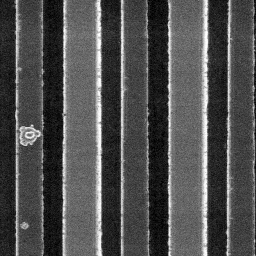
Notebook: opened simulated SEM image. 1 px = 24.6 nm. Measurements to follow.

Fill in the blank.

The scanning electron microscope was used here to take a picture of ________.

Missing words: lines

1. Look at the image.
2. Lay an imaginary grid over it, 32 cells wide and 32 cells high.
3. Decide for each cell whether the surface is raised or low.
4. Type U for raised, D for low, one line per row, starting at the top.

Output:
DDUUUDDDUUUUDDDUUUDDDUUUUUDDDUUU
DDUUUDDDUUUUDDDUUUDDDUUUUUDDDUUU
DDUUUDDDUUUUDDDUUUDDDUUUUUDDDUUU
DDUUUDDDUUUUDDDUUUDDDUUUUUDDDUUU
DDUUUDDDUUUUDDDUUUDDDUUUUUDDDUUU
DDUUUDDDUUUUDDDUUUDDDUUUUUDDDUUU
DDUUUDDDUUUUDDDUUUDDDUUUUUDDDUUU
DDUUUDDDUUUUDDDUUUDDDUUUUUDDDUUU
DDUUUDDDUUUUDDDUUUDDDUUUUUDDDUUU
DDUUUDDDUUUUDDDUUUDDDUUUUUDDDUUU
DDUUUDDDUUUUDDDUUUDDDUUUUUDDDUUU
DDUUUDDDUUUUDDDUUUDDDUUUUUDDDUUU
DDUUUDDDUUUUDDDUUUDDDUUUUUDDDUUU
DDUUUDDDUUUUDDDUUUDDDUUUUUDDDUUU
DDUUUDDDUUUUDDDUUUDDDUUUUUDDDUUU
DDUUUDDDUUUUDDDUUUDDDUUUUUDDDUUU
DDUUUDDDUUUUDDDUUUDDDUUUUUDDDUUU
DDUUUDDDUUUUDDDUUUDDDUUUUUDDDUUU
DDUUUDDDUUUUDDDUUUDDDUUUUUDDDUUU
DDUUUDDDUUUUDDDUUUDDDUUUUUDDDUUU
DDUUUDDDUUUUDDDUUUDDDUUUUUDDDUUU
DDUUUDDDUUUUDDDUUUDDDUUUUUDDUUUU
DDUUUDDDUUUUDDDUUUDDDUUUUUDDUUUU
DDUUUDDDUUUUDDDUUUDDDUUUUUDDUUUU
DDUUUDDDUUUUDDDUUUDDDUUUUUDDDUUU
DDUUUDDDUUUUDDDUUUUDDUUUUUDDUUUU
DDUUUDDDUUUUDDDUUUDDDUUUUUDDUUUU
DDUUUDDDUUUUDDDUUUDDDUUUUUDDUUUU
DDUUUDDDUUUUDDDUUUDDDUUUUUDDUUUU
DDUUUDDDUUUUDDDUUUUDDUUUUUDDUUUU
DDUUUDDDUUUUDDDUUUDDDUUUUUDDUUUU
DDUUUDDDUUUUDDDUUUUDDUUUUUDDUUUU